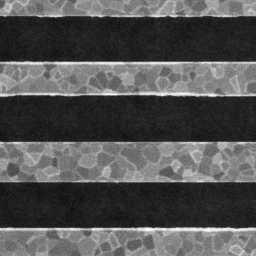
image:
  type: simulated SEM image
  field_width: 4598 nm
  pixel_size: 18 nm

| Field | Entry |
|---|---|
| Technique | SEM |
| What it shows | lines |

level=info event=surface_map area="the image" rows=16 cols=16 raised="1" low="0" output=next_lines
1111111111111111
0000000000000000
0000000000000000
0000000000000000
1111111111111111
1111111111111111
0000000000000000
0000000000000000
0000000000000000
1111111111111111
1111111111111111
0000000000000000
0000000000000000
0000000000000000
1111111111111111
1111111111111111